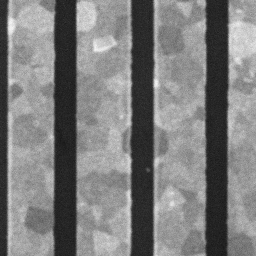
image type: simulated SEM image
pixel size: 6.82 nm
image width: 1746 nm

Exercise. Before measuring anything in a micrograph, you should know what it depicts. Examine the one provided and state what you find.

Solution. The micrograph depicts lines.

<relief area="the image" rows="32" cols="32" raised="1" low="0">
01111110001111110001111111000111
01111110001111110001111111000111
01111110001111110001111111000111
01111110001111110001111111000111
01111110001111110001111111000111
01111110001111110001111111000111
01111110001111110001111111000111
01111110001111110001111111000111
01111110001111110001111111000111
01111110001111110001111111000111
01111110001111110001111111000111
01111110001111110001111111000111
01111110001111110001111111000111
01111110001111110001111111000111
01111110001111110001111111000111
01111110001111110001111111000111
01111110001111110001111111000111
01111110001111110001111111000111
01111110001111110001111111000111
01111110001111110001111111000111
01111110001111110001111111000111
01111110001111110001111111000111
01111110001111110001111111000111
01111110001111110001111111000111
01111110001111110001111111000111
01111110001111110001111111000111
01111110001111110001111111000111
01111110001111110001111111001111
01111110001111110001111111000111
01111110001111110001111111000111
01111110001111110001111111000111
01111110001111110001111111001111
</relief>